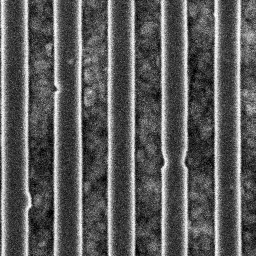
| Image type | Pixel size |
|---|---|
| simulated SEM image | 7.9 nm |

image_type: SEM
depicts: parallel lines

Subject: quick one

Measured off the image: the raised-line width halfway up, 198 nanometers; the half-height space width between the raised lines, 221 nanometers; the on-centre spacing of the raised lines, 420 nm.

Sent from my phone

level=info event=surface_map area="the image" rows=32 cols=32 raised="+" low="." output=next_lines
+++....+++....+++...+++....+++..
+++....+++....+++...+++....+++..
+++....+++....+++...+++....+++..
+++....+++....+++...+++....+++..
+++....+++....+++...+++....+++..
+++....+++....+++...+++....+++..
+++....+++....+++...+++....+++..
+++....+++....+++...+++....+++..
+++....+++....+++...+++....+++..
+++....+++....+++...+++....+++..
+++....+++....+++...+++....+++..
+++....+++....+++...+++....+++..
+++....+++....+++...+++....+++..
+++....+++....+++...+++....+++..
+++....+++....+++...+++....+++..
+++....+++....+++...+++....+++..
+++....+++....+++...+++....+++..
+++....+++....+++...+++....+++..
+++....+++....+++...+++....+++..
+++....+++....+++...+++....+++..
+++....+++....+++....++....+++..
+++....+++....+++...+++....+++..
+++....+++....+++...+++....+++..
+++....+++....+++...+++....+++..
++++...+++....+++...+++....+++..
++++...+++....+++...+++....+++..
++++...+++....+++...+++....+++..
+++....+++....+++...+++....+++..
+++....+++....+++...+++....+++..
+++....+++....+++...+++....+++..
+++....+++....+++...+++....+++..
+++....+++....+++...+++....+++..